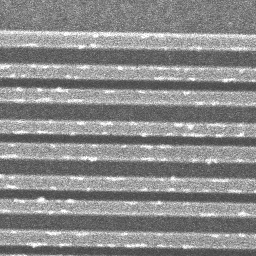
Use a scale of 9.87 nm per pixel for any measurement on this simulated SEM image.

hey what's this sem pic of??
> parallel lines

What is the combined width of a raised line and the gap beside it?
280 nanometers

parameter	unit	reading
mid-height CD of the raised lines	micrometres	0.148